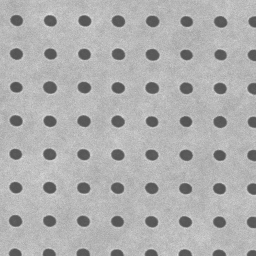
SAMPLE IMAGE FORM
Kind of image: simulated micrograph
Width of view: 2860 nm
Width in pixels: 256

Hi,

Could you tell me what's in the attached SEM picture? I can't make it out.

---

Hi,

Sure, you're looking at a regular array of holes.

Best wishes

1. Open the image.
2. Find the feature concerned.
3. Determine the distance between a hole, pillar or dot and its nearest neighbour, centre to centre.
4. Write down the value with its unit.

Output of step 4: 0.371 um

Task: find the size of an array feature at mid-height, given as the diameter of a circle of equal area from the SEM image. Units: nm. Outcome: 140